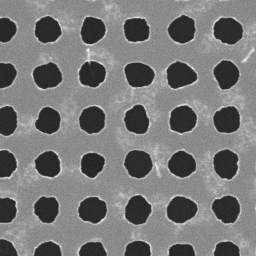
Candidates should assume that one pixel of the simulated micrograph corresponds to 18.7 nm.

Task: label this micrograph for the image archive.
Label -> a regular array of holes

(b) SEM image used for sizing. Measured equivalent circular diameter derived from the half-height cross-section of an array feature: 504 nanometres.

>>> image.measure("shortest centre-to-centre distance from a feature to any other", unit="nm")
820